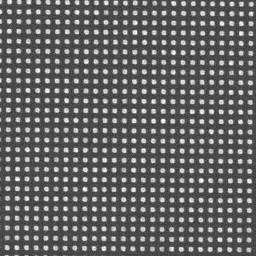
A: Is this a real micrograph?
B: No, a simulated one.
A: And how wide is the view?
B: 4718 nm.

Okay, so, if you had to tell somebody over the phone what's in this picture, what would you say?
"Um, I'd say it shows a regular array of raised bodies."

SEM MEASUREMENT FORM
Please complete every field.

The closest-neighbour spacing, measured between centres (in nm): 175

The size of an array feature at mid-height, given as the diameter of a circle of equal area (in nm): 75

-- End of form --